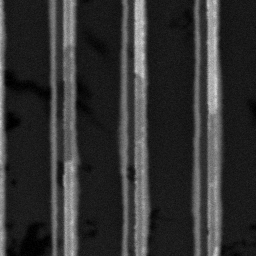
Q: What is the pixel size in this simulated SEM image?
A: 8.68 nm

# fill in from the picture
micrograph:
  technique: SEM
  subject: lines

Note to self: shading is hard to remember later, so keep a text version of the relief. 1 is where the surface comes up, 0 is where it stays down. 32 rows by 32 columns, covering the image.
00000001100000001100000001100000
00000001100000001100000001100000
00000001100000001100000001100000
00000001100000001100000001100000
00000001100000001100000001100000
00000001100000001100000001100000
00000001100000001100000001100000
00000001100000001100000001100000
00000001100000001100000001100000
00000001100000001100000001100000
00000001100000001100000001100000
00000001100000001100000001100000
00000001100000001100000001100000
00000001100000001100000001100000
00000001100000001100000001100000
00000001100000001100000001100000
00000001100000001100000001100000
00000001100000001100000001100000
00000001100000001100000001100000
00000001100000001100000001100000
00000001100000001100000001100000
00000001100000001100000001100000
00000001100000001100000001100000
00000001100000001100000001100000
00000001100000001100000001100000
00000001100000001100000001100000
00000001100000001100000001100000
00000001100000001100000001100000
00000001100000001100000001100000
00000001100000001100000001100000
00000001100000001100000001100000
00000001100000001100000001100000